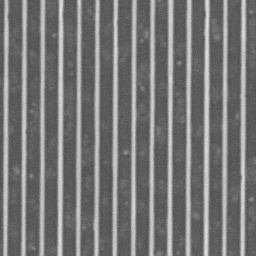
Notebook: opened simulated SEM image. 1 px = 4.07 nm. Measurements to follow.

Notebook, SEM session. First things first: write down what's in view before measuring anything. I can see parallel lines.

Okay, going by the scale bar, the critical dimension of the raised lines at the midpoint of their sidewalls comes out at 0.0138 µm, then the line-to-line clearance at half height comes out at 61.6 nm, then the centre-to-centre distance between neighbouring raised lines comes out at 0.0743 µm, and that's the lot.